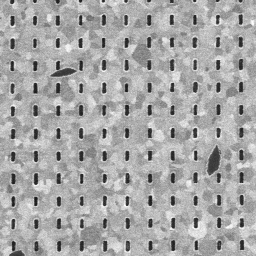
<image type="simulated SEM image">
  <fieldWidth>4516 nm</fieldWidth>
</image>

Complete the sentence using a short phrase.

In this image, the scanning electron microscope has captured a regular array of holes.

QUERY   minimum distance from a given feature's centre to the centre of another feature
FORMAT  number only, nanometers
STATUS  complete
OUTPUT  395